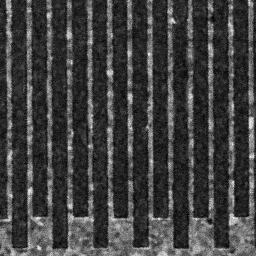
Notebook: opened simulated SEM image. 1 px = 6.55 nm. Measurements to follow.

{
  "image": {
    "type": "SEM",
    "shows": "parallel lines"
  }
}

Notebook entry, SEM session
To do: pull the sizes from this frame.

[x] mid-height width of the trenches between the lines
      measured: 0.107 microns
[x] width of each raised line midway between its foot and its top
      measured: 22.9 nanometers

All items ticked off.